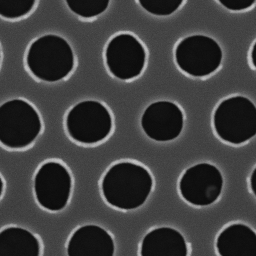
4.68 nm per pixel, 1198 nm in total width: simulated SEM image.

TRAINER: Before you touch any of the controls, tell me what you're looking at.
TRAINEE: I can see a regular array of holes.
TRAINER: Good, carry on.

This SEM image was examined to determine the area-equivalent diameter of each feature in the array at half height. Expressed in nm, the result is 198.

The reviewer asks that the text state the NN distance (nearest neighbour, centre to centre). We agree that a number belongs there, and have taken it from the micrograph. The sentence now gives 345 nm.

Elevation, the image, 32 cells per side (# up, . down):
....####......####.....#####...#
...######....######...##########
################################
################################
######.########.########.#######
####....######....####.....#####
####.....####.....####......####
###......####.....####......####
####.....#####....#####....#####
#####...#######..###############
################################
################################
############################...#
....#####....#####....#####.....
.....####.....####.....####.....
.....###......####.....####.....
.....####.....####.....####.....
....######...#######.#######...#
################################
################################
######.########..########.######
#####...######....#####....#####
####.....####......####.....###.
####.....####......####.....####
#####....####.....#####....#####
#####...######....######..######
################################
################################
##########...#######.#######...#
....#####.....####.....####.....
.....####.....####.....####.....
.....###......####.....####.....